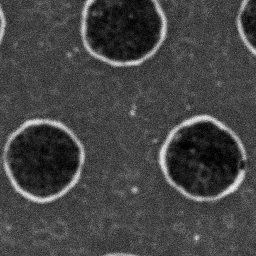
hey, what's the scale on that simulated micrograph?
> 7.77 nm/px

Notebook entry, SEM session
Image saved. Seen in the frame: raised bodies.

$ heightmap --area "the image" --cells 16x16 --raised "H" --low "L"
LLLLLHHHHHLLLLLH
LLLLLHHHHHLLLLLH
LLLLLHHHHHLLLLLH
LLLLLLHHHLLLLLLL
LLLLLLLLLLLLLLLL
LLLLLLLLLLLLLLLL
LLLLLLLLLLLLLLLL
LLLLLLLLLLLLHLLL
LHHHHLLLLLLHHHHL
HHHHHLLLLLHHHHHL
HHHHHLLLLLHHHHHL
LHHHHLLLLLLHHHHL
LLHLLLLLLLLLLLLL
LLLLLLLLLLLLLLLL
LLLLLLLLLLLLLLLL
LLLLLLLLLLLLLLLL